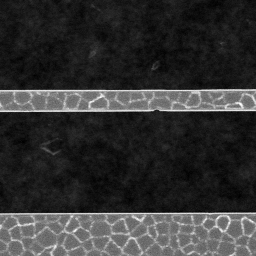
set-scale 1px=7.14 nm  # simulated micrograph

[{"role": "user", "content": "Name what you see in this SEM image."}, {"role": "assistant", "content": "one or a few lines or trenches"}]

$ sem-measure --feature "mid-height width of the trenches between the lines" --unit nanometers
729